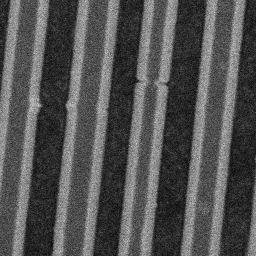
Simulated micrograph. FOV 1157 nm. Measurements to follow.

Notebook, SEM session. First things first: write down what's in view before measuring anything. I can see one or a few lines or trenches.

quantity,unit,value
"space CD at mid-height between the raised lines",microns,0.175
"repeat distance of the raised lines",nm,290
